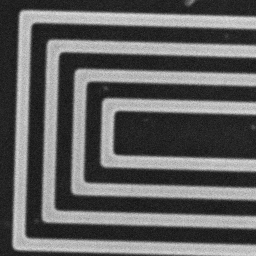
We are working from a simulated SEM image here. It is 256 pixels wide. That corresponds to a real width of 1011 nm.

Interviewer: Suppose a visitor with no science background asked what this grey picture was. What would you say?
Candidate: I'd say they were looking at groups of lines, slits or small figures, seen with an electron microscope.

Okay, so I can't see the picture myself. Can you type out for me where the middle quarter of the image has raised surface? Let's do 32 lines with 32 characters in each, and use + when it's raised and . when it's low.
................................
...+++..........................
...+++++++++++++++++++++++++++++
...+++++++++++++++++++++++++++++
...+++...............+++++++++++
...++...........................
...++...........................
...++...........................
...++...........................
...++.....++++++++++++++++++++++
...++.....++++++++++++++++++++++
...++.....++++++++++++++++++++++
...++.....+++...................
...++.....++....................
...++.....++....................
...++.....++....................
..+++....+++....................
..+++....+++....................
..+++....+++....................
..+++....+++....................
..+++....+++....................
..+++....+++....................
..+++....++++...................
..+++....+++++++++++++++++++++++
..+++....+++++++++++++++++++++++
..+++.....++++++++++++++++++++++
..+++...........................
..+++...........................
..+++...........................
..+++...........................
..++++++++++++++++++++++........
..++++++++++++++++++++++++++++++